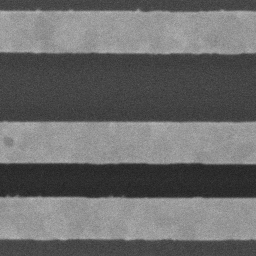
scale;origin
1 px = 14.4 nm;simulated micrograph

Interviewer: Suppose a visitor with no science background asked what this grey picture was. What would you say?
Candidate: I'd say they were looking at lines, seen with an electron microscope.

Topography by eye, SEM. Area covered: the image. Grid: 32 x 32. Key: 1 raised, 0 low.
00000000000000000000000000000000
11111111111111111111100001111111
11111111111111111111111111111111
11111111111111111111111111111111
11111111111111111111111111111111
11111111111111111111111111111111
00001111111111111111111111111111
00000000000000000000000000000000
00000000000000000000000000000000
00000000000000000000000000000000
00000000000000000000000000000000
00000000000000000000000000000000
00000000000000000000000000000000
00000000000000000000000000000000
00000000000000000000000000000000
11111111111111111111111111111111
11111111111111111111111111111111
11111111111111111111111111111111
11111111111111111111111111111111
11111111111111111111111111111111
00000000000000000000000000000000
00000000000000000000000000000000
00000000000000000000000000000000
00000000000000000000000000000000
00000000000000000000000000000000
11111111111111111111111111111111
11111111111111111111111111111111
11111111111111111111111111111111
11111111111111111111111111111111
11111111111111111111111111111111
00000000000000000000000000000000
00000000000000000000000000000000